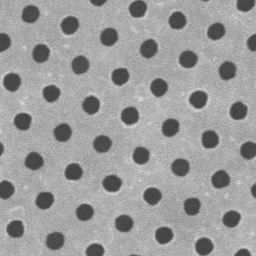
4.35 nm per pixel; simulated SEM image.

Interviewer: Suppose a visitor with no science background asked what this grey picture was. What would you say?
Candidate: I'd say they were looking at a regular array of holes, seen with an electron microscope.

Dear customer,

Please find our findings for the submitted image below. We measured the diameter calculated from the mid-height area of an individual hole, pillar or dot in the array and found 78.1 nm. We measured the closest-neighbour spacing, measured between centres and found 0.174 um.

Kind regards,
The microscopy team